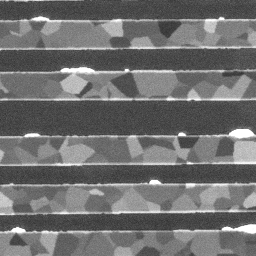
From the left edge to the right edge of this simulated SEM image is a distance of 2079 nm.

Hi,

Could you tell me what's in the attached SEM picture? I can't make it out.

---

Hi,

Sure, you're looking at lines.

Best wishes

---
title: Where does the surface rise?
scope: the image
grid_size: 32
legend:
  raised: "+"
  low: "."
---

................................
................................
....++........+++.+.++++++++++++
++++++++++++++++++++++++++++++++
++++++++++++++++++++++++++++++++
++++++++++++++++++++++++++++++++
................................
................................
................................
++++++++++++++++++++++++++++++++
++++++++++++++++++++++++++++++++
++++++++++++++++++++++++++++++++
................................
................................
................................
................................
.............................++.
++++++++++++++++++++++++++++++++
++++++++++++++++++++++++++++++++
++++++++++++++++++++++++++++++++
++++++++++++++++++++............
................................
................................
++++++++++++++++++++++++++++++++
++++++++++++++++++++++++++++++++
++++++++++++++++++++++++++++++++
+++++++++++++++++++.............
................................
............................+.++
++++++++++++++++++++++++++++++++
++++++++++++++++++++++++++++++++
++++++++++++++++++++++++++++++++